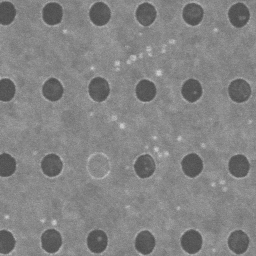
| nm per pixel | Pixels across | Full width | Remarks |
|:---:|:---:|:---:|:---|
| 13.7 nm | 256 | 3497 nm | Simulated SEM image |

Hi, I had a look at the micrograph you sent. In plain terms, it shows a regular array of holes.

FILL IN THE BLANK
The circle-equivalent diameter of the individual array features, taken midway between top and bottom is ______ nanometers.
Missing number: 323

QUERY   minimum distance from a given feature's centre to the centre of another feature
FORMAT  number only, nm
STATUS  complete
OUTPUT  632